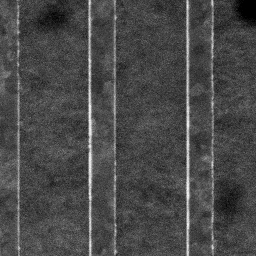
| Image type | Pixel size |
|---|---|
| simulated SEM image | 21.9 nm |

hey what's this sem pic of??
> lines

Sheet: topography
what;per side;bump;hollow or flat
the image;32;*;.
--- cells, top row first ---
**.........***.........****.....
**.........***.........****.....
**.........***.........****.....
**.........***.........****.....
**.........***.........****.....
**.........***.........****.....
**.........***.........****.....
**.........***.........****.....
**.........***.........***......
**.........***.........****.....
**.........***.........****.....
**.........***.........****.....
**.........***.........****.....
**.........***.........****.....
**.........***..........***.....
**.........***..........***.....
**.........***..........***.....
**.........***..........***.....
**.........***..........**......
**.........***..........***.....
**.........***..........***.....
**.........***..........***.....
**.........***..........***.....
**.........***..........***.....
**.........***..........***.....
**.........***.........****.....
**.........***..........***.....
**.........***..........***.....
**.........***..........**......
**.........***..........***.....
**.........***.........****.....
**.........***..........***.....